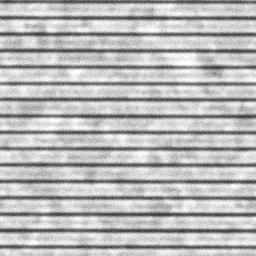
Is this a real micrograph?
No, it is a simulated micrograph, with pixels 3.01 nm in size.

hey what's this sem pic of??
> parallel lines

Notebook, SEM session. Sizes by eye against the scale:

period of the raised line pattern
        49.3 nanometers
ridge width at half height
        35.8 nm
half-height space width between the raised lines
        12.8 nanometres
